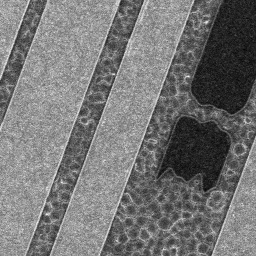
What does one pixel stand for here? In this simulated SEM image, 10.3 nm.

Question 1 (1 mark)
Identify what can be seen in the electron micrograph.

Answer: one or a few lines or trenches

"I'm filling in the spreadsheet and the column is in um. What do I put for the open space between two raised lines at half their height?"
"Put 0.238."